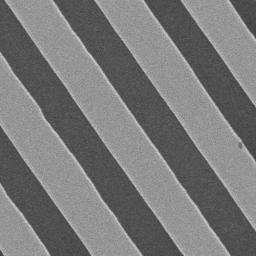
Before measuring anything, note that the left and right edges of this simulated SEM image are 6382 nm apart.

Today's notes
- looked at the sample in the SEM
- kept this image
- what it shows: lines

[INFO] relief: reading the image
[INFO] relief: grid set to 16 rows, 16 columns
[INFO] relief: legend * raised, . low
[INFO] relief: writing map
.***..***...***.
.***...***..***.
..***...***..***
...***..***...**
*..***...***..**
**..***...***..*
**...***..***...
***...***..***..
****..***...***.
.***...***...***
..***...***..***
...***..***...**
*..***...***...*
*...***...***..*
**...***..***...
***..****..***..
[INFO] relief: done